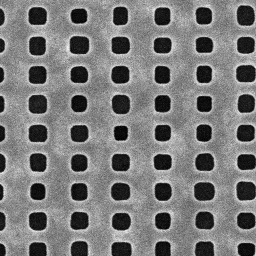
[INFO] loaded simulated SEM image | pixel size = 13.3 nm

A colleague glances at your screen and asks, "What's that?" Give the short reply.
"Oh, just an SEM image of a regular array of holes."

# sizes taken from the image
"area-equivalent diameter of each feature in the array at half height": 0.246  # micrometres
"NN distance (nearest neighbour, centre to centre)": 0.387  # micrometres